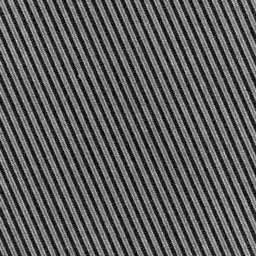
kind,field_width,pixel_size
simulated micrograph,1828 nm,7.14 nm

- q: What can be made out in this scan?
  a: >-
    parallel lines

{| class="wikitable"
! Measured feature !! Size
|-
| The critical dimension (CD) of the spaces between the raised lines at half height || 40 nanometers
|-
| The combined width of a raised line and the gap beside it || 63.6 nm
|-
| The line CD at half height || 26.2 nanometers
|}